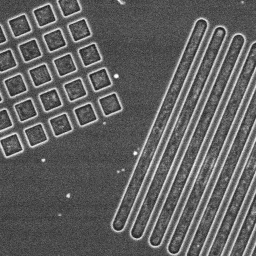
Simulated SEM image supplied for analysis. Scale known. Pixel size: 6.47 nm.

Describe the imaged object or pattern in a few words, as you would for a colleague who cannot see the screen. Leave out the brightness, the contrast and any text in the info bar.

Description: groups of lines, slits or small figures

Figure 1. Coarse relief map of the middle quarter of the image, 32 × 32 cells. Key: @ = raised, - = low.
---@@-@@@@@@@@@@@@@@@@@@@@@@@---
---@@@@@@-@@@@@@@@@@@@@@@@@@---@
-@@@@@@----@@@@@@@@@@@@@@@@@---@
@@@@@@-----@@@@@@@@@@@@@@@@----@
@@---@@-----@@@@@@@@@@@@@@@---@@
-----@@----@@@@@@@@@@@@@@@----@@
-----@@@-@@@@@@@@@@@@@@@@@---@@@
@----@@@@@@@@@@@@@@@@@@@@@---@@-
@---@@@@@----@@@@@@@@@@@@----@@-
@@@@@@@@@-----@@@@@@@@@@@---@@--
@@@@---@@-----@@@@@@@@@@----@@--
@@@----@@@----@@@@@@@@@@---@@---
-@@-----@@-@@@@@@@@@@@@----@@---
-@@-----@@@@@@@@@@@@@@@---@@----
-@@@---@@@@@@@@@@@@@@@@---@@---@
--@@@@@@@@@@@@@@@@@@@@----@@---@
--@@@@@@@@@@@@@@@@@@@@---@@----@
@@@@@@@@@@@@@@@@@@@@@----@@---@@
@@@@@@@@@@@@@@@@@@@@@---@@----@@
@@@@@@@@@@@@@@@@@@@@@---@@---@@-
@@@@@@@@@@@@@@@@@@@@---@@@---@@-
@@@@@@@@@@@@@@@@@@@@---@@----@@-
@@@@@@@@@@@@@@@@@@@----@@---@@--
@@@@@@@@@@@@@@@@@@@---@@----@@--
@@@@@@@@@@@@@@@@@@----@@---@@---
@@@@@@@@@@@@@@@@@@---@@----@@---
@@@@@@@@@@@@@@@@@@---@@----@----
@@@@@@@@@@@@@@@@@----@@---@@----
@@@@@@@@@@@@@@@@@---@@----@@---@
@@@@@@@@@@@@@@@@----@@---@@----@
@@@@@@@@@@@@@@@@---@@----@@---@@
@@@@@@@@@@@@@@@@---@@---@@----@@